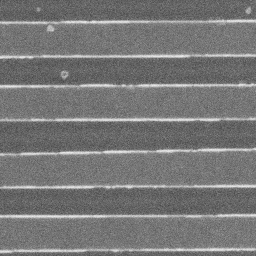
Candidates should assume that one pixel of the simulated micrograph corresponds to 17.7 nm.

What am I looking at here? lines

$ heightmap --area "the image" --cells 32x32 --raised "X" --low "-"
--------------------------------
--------------------------------
--------------------------------
XXXXXXXXXXXXXXXXXXXXXXXXXXXXXXXX
XXXXXXXXXXXXXXXXXXXXXXXXXXXXXXXX
XXXXXXXXXXXXXXXXXXXXXXXXXXXXXXXX
XXXXXXXXXXXXXXXXXXXXXXXXXXXXXXXX
--------------------------------
--------------------------------
--------------------------------
--------------------------------
XXXXXXXXXXXXXXXXXXXXXXXXXXXXXXXX
XXXXXXXXXXXXXXXXXXXXXXXXXXXXXXXX
XXXXXXXXXXXXXXXXXXXXXXXXXXXXXXXX
XXXXXXXXXXXXXXXXXXXXXXXXXXXXXXXX
--------------------------------
--------------------------------
--------------------------------
--------------------------------
XXXXXXXXXXXXXXXXXXXXXXXXXXXXXXXX
XXXXXXXXXXXXXXXXXXXXXXXXXXXXXXXX
XXXXXXXXXXXXXXXXXXXXXXXXXXXXXXXX
XXXXXXXXXXXXXXXXXXXXXXXXXXXXXXXX
--------------------------------
--------------------------------
--------------------------------
--------------------------------
XXXXXXXXXXXXXXXXXXXXXXXXXXXXXXXX
XXXXXXXXXXXXXXXXXXXXXXXXXXXXXXXX
XXXXXXXXXXXXXXXXXXXXXXXXXXXXXXXX
XXXXXXXXXXXXXXXXXXXXXXXXXXXXXXXX
--------------------------------